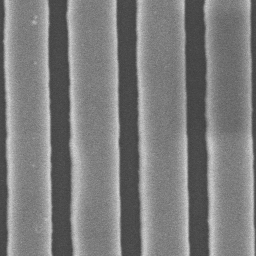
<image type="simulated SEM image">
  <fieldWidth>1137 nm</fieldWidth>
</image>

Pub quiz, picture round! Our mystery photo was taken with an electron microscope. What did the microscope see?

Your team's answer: lines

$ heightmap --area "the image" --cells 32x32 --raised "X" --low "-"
-XXXXX--XXXXXXX--XXXXXX--XXXXXX-
-XXXXX--XXXXXXX--XXXXXX--XXXXXX-
-XXXXX--XXXXXXX--XXXXXX---XXXXX-
-XXXXX--XXXXXXX--XXXXXX---XXXXX-
-XXXXX---XXXXXX--XXXXXX---XXXXX-
-XXXXX---XXXXXX--XXXXXX---XXXXX-
-XXXXX---XXXXXX--XXXXXX---XXXXX-
-XXXXX---XXXXXX--XXXXXX---XXXXX-
-XXXXX---XXXXXX--XXXXXX---XXXXX-
-XXXXX---XXXXXX--XXXXXX---XXXXX-
-XXXXX---XXXXXX--XXXXXX---XXXXX-
-XXXXX---XXXXXX--XXXXXX---XXXXX-
-XXXXX---XXXXXX--XXXXXX---XXXXX-
-XXXXX---XXXXXX--XXXXXX---XXXXXX
-XXXXX---XXXXXX--XXXXXX---XXXXX-
-XXXXX---XXXXXX--XXXXXX---XXXXX-
-XXXXX---XXXXXX--XXXXXX---XXXXX-
-XXXXX---XXXXXX--XXXXXX---XXXXXX
-XXXXX---XXXXXX--XXXXXX---XXXXXX
-XXXXX---XXXXXX--XXXXXX---XXXXXX
-XXXXX---XXXXXX--XXXXXX---XXXXXX
-XXXXX---XXXXXX--XXXXXX---XXXXXX
-XXXXX---XXXXXX--XXXXXX---XXXXXX
-XXXXX---XXXXXX--XXXXXXX--XXXXXX
-XXXXX---XXXXXX--XXXXXXX--XXXXXX
-XXXXX---XXXXXX---XXXXXX--XXXXXX
-XXXXX---XXXXXX---XXXXXX--XXXXXX
-XXXXX---XXXXXX---XXXXXX--XXXXXX
-XXXXX---XXXXXX---XXXXXX--XXXXXX
-XXXXX---XXXXXX---XXXXXX--XXXXXX
-XXXXX---XXXXXX---XXXXXX--XXXXXX
-XXXXX---XXXXXX---XXXXXX--XXXXXX